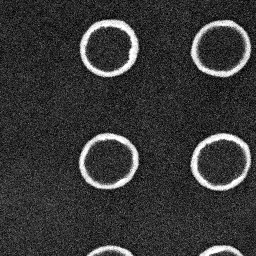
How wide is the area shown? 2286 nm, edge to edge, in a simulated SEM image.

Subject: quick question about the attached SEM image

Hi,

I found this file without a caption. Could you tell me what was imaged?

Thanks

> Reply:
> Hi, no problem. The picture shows raised bodies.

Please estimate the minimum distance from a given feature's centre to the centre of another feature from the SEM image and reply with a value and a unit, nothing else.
1000 nm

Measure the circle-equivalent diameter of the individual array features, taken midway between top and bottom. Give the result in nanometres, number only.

487